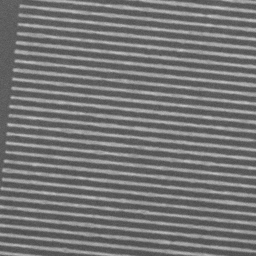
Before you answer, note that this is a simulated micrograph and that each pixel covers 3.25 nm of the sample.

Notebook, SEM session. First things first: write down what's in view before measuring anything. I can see parallel lines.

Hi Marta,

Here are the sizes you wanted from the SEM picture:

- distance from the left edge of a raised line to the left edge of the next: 0.0298 micrometres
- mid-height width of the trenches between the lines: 21 nm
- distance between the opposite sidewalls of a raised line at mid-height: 8.5 nanometres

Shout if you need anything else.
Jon